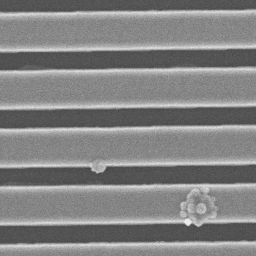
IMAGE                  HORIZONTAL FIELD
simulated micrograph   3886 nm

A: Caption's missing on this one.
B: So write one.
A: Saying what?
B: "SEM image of lines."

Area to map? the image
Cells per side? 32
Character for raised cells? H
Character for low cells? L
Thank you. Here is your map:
LLLLLLLLLLLLLLLLLLLLLLLLLLLLLLLL
LLLLLLLLLLLLLLLHHHHHHHHHHHHHHHHH
HHHHHHHHHHHHHHHHHHHHHHHHHHHHHHHH
HHHHHHHHHHHHHHHHHHHHHHHHHHHHHHHH
HHHHHHHHHHHHHHHHHHHHHHHHHHHHHHHH
HHHHHHHHHHHHHHHHHHHHHHHHHHHHHHHH
LLLLLLLLLLLLLLLLLLLLLLLLLLLLLLLL
LLLLLLLLLLLLLLLLLLLLLLLLLLLLLLLL
LLLLLLLLLLLLLLLLLLLLLLLLLLLLHHHH
HHHHHHHHHHHHHHHHHHHHHHHHHHHHHHHH
HHHHHHHHHHHHHHHHHHHHHHHHHHHHHHHH
HHHHHHHHHHHHHHHHHHHHHHHHHHHHHHHH
HHHHHHHHHHHHHHHHHHHHHHHHHHHHHHHH
HHHHHHHHHLLLLLLLLLLLLLLLLLLLLLLL
LLLLLLLLLLLLLLLLLLLLLLLLLLLLLLLL
LLLLLLLLLLLLLLLLLLLLLLLLLLLLLLLL
HHHHHHHHHHHHHHHHHHHHHHHHHHHHHHHH
HHHHHHHHHHHHHHHHHHHHHHHHHHHHHHHH
HHHHHHHHHHHHHHHHHHHHHHHHHHHHHHHH
HHHHHHHHHHHHHHHHHHHHHHHHHHHHHHHH
HHHHHHHHHHHHHHHHHHHHHHHHHHHHHHHH
LLLLLLLLLLLLHLLLLLLLLLLLLLLLLLLL
LLLLLLLLLLLLLLLLLLLLLLLLLLLLLLLL
HHHHHHHHHHHHHHHHHHHHHHHHHHHHHHHH
HHHHHHHHHHHHHHHHHHHHHHHHHHHHHHHH
HHHHHHHHHHHHHHHHHHHHHHHHHHHHHHHH
HHHHHHHHHHHHHHHHHHHHHHHHHHHHHHHH
HHHHHHHHHHHHHHHHHHHHHHHHHHHHHHHH
LLLLLLLLLLLLLLLLLLLLLLLLLLLLLLLL
LLLLLLLLLLLLLLLLLLLLLLLLLLLLLLLL
LLLLLLLLLLHHHHHHHHHHHHHHHHHHHHHH
HHHHHHHHHHHHHHHHHHHHHHHHHHHHHHHH